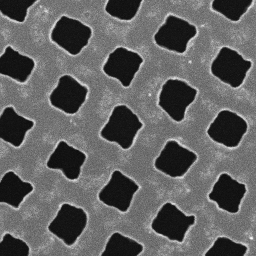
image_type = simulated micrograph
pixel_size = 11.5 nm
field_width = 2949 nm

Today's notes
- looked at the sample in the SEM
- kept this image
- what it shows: a regular array of holes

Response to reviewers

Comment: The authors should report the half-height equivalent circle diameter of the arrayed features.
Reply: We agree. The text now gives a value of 0.411 micrometres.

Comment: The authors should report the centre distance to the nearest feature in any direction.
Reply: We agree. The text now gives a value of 0.697 um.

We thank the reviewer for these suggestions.